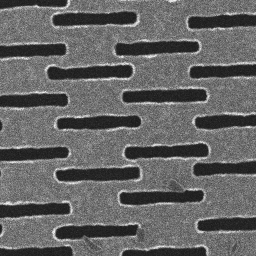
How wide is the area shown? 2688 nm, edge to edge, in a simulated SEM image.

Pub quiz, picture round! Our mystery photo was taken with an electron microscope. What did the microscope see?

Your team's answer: a regular array of holes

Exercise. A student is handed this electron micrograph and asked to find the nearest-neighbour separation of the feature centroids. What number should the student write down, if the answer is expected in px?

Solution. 50.7